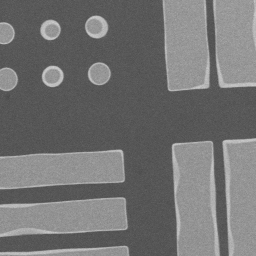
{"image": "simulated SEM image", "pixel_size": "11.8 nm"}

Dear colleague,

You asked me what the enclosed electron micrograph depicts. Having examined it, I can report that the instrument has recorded groups of lines, slits or small figures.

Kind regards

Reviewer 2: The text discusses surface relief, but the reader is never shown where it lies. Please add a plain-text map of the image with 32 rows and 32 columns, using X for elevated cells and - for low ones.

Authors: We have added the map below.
--------------------XXXXXX-XXXXX
--------------------XXXXXX-XXXXX
-----------XX--------XXXXX-XXXXX
XX---XX----XX--------XXXXX-XXXXX
XX----X--------------XXXXX-XXXXX
---------------------XXXXX-XXXXX
---------------------XXXXX-XXXXX
---------------------XXXXX-XXXXX
------X----XXX-------XXXXX-XXXXX
XX---XXX---XXX-------XXXXX--XXXX
XX----X-----X--------XXXXX--XXXX
--------------------------------
--------------------------------
--------------------------------
--------------------------------
--------------------------------
--------------------------------
-------------------------------X
----------------------XXXXX-XXXX
--XXXXXXXXXXXXX-------XXXXX-XXXX
XXXXXXXXXXXXXXX-------XXXXX-XXXX
XXXXXXXXXXXXXXX-------XXXXX-XXXX
XXXXXXXXXXXXXXX-------XXXXX--XXX
XXX-------------------XXXXX--XXX
----------------------XXXXX--XXX
-----XXXXXXXXXXX------XXXXX--XXX
XXXXXXXXXXXXXXXX------XXXXX--XXX
XXXXXXXXXXXXXXXX------XXXXX--XXX
XXXXXXXXXXXXXXXX------XXXXX--XXX
----------------------XXXXX--XXX
----------------------XXXXX--XXX
-----XXXXXXXXXXX------XXXXX--XXX